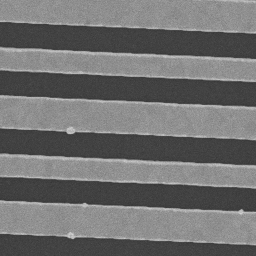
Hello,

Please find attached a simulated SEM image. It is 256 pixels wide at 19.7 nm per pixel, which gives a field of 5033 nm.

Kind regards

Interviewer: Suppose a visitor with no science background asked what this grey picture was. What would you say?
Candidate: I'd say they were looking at lines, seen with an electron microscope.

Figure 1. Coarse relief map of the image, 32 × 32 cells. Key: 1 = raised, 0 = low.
11111111111111111111111111111111
11111111111111111111111111111111
11111111111111111111111111111111
00000000000000000011111111111111
00000000000000000000000000000000
00000000000000000000000000000000
11111111111100000000000000000000
11111111111111111111111111111111
11111111111111111111111111111111
00000000000000011111111111111111
00000000000000000000000000000000
00000000000000000000000000000000
11111111111000000000000000000000
11111111111111111111111111111111
11111111111111111111111111111111
11111111111111111111111111111111
00000000110011111111111111111111
00000000000000000000000000000000
00000000000000000000000000000000
11111100000000000000000000000000
11111111111111111111111111110000
11111111111111111111111111111111
00000000011111111111111111111111
00000000000000000000000000000001
00000000000000000000000000000000
11111111101000000000000000000000
11111111111111111111111111111110
11111111111111111111111111111111
11111111111111111111111111111111
00000000111111111111111111111111
00000000000000000000000000000001
00000000000000000000000000000000